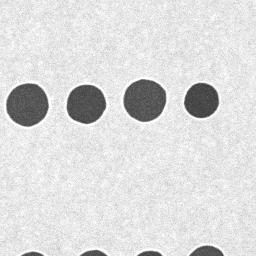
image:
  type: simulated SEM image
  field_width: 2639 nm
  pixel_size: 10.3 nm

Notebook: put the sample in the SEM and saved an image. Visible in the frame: holes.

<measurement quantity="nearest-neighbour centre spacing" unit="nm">595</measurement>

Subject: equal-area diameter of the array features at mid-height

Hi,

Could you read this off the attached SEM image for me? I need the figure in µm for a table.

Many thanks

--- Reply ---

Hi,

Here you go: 0.43